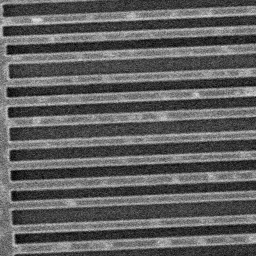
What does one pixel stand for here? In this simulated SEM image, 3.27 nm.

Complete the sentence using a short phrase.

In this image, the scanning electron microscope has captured parallel lines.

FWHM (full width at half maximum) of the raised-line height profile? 28.6 nm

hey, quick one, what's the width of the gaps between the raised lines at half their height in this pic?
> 11.6 px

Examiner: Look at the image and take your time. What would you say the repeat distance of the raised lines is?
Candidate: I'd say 67.7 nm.